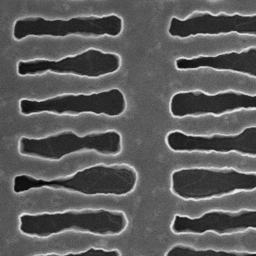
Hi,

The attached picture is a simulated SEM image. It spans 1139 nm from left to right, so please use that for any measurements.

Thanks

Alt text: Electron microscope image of holes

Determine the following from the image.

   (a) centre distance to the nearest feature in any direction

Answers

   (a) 40.3 px